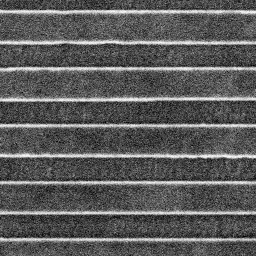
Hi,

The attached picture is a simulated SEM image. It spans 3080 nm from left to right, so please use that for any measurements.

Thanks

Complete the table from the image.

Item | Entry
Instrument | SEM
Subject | lines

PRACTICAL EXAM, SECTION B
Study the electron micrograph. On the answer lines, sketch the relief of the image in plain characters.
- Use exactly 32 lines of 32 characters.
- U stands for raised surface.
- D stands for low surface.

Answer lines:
DDDDDDDDDDDDDDDDDDDDDDDDDDDDDDDD
UUUUUUUUUUUUUUUUUUUUUUUUUUUUUUUU
UUUUUUUUUUUUUUUUUUUUUUUUUUUUUUUU
UUUUUUUUUUUUUUUUUUUUUUUUUUUUUUUU
UUUUUUUUUUUUUUUUUUUUUUUUUUUUUUUU
DDDDDDDDDDDDDDDDDDDDDDDDDDDDDDDD
DDDDDDDDDDDDDDDDDDDDDDDDDDDDDDDD
DDDDDDDDDDDDDDDDDDDDDDDDDDDDDDDD
DDDDDDDDDDDDDDDDDDDDDDDDDDDDDDDD
UUUUUUUUUUUUUUUUUUUUUUUUUUUUUUUU
UUUUUUUUUUUUUUUUUUUUUUUUUUUUUUUU
UUUUUUUUUUUUUUUUUUUUUUUUUUUUUUUU
UUUUUUUUUUUUUUUUUUUDDDDDDDDDDDDD
DDDDDDDDDDDDDDDDDDDDDDDDDDDDDDDD
DDDDDDDDDDDDDDDDDDDDDDDDDDDDDDDD
DDDDDDDDDDDDDDDDDDDDDDDDDDDDDDDD
UUUUUUUUUUUUUUUUUUUUUUUUUUUUUUUU
UUUUUUUUUUUUUUUUUUUUUUUUUUUUUUUU
UUUUUUUUUUUUUUUUUUUUUUUUUUUUUUUU
UUUUUUUUUUUUUUUUUUUUUUUUUUUUUUUU
DDDDDDDDDDDDDDDDDDDDDDDDDDDDDDDD
DDDDDDDDDDDDDDDDDDDDDDDDDDDDDDDD
DDDDDDDDDDDDDDDDDDDDDDDDDDDDDDDD
UUUUUUUUUUUUUUUUUUUUUUUUUUUUUUUU
UUUUUUUUUUUUUUUUUUUUUUUUUUUUUUUU
UUUUUUUUUUUUUUUUUUUUUUUUUUUUUUUU
UUUUUUUUUUUUUUUUUUUUUUUUUUUUUUUU
DDDDDDDDDDDDDDDDDDDDDDDDDDDDDDDD
DDDDDDDDDDDDDDDDDDDDDDDDDDDDDDDD
DDDDDDDDDDDDDDDDDDDDDDDDDDDDDDDD
UUUUUUUUUUUUUUUUUUUUUUUUUUUUUUUU
UUUUUUUUUUUUUUUUUUUUUUUUUUUUUUUU